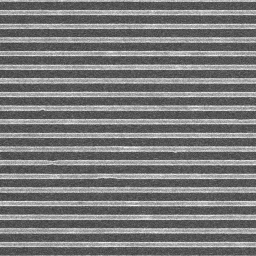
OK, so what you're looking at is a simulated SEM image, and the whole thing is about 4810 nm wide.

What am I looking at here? parallel lines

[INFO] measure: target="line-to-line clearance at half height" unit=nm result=172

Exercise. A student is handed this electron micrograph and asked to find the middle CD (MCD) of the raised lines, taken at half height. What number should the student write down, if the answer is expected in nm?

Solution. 86.9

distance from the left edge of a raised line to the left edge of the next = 13.6 px